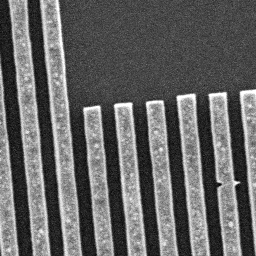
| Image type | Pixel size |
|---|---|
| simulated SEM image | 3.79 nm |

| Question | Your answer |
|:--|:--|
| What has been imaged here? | parallel lines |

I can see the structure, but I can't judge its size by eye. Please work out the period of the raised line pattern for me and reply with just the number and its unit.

0.12 micrometres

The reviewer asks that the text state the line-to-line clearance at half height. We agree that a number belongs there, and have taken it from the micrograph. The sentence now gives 57.5 nanometres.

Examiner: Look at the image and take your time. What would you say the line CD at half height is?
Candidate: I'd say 0.0613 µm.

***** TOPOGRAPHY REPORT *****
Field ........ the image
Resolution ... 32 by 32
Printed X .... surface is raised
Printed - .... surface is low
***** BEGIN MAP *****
-XX--XX-------------------------
-XX--XX-------------------------
-XX--XX-------------------------
--X--XXX------------------------
--XX--XX------------------------
--XX--XX------------------------
--XX--XX------------------------
--XX--XX------------------------
--XX--XX------------------------
--XX--XX------------------------
--XX--XX------------------------
--XX--XX----------------------XX
--XX--XX--------------XX--XX--XX
X--XX-XXX--X--XX--XX--XX--XX--XX
X--XX--XX--XX--X--XXX--XX-XX--XX
X--XX--XX--XX--XX--XX--XX-XXX-XX
X--XX--XX--XX--XX--XX--XX--XX--X
X--XX--XX--XX--XX--XX--XX--XX--X
X--XX--XX--XX--XX--XX--XX--XX--X
X--XX--XX--XX--XX--XX--XX--XX--X
X--XX--XX--XX--XX--XX--XX--XX--X
X--XX--XX--XX--XX--XX--XX--XX--X
X--XX--XX--XX--XX--XX--XX--XX--X
X--XX--XX--XX--XX--XX--XX--XX--X
XX--X--XXX--X--XX--XX--XX--XX--X
XX--XX--XX--XX--XX-XX---XX-XX--X
XX--XX--XX--XX--XX--XX--XX-XXX--
XX--XX--XX--XX--XX--XX--XX--XX--
XX--XX--XX--XX--XX--XX--XX--XX--
XX--XX--XX--XX--XX--XX--XX--XX--
XX--XX--XX--XX--XX--XX--XX--XX--
XX--XX--XX--XX--XX--XX--XX--XX--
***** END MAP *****